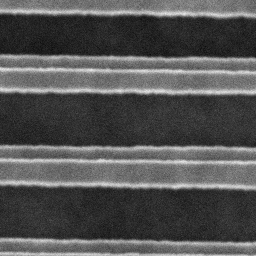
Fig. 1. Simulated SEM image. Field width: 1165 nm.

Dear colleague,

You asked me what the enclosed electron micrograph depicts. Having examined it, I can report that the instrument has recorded lines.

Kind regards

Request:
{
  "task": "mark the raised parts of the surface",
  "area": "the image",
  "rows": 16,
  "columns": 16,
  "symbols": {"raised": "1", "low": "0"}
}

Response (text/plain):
1111111111111111
0000000000000000
0000000000000000
1000000000000000
1111111111111111
1111111111111111
0000000000000000
0000000000000000
0000000000000000
1111111111111111
1111111111111111
0011111111111111
0000000000000000
0000000000000000
0000000000000000
1111111111111111